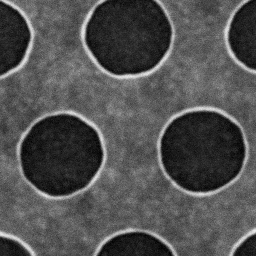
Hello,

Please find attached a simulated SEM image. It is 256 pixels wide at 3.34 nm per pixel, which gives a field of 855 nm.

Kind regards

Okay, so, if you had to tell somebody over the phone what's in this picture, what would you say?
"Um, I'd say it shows holes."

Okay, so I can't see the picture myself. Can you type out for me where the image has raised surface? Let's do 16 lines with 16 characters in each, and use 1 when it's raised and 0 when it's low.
0111110000111110
0011100000011100
0011100000011100
0011110000111110
0111111001111111
1111111111111111
1111111111111111
1110011111100011
1100001111000001
1000001111000001
1000001111000001
1100001111100011
1111111111111111
1111111111111111
1111111111111111
0011110000011110